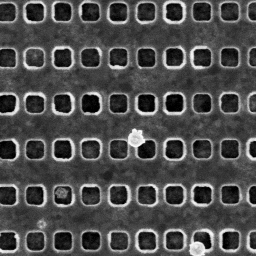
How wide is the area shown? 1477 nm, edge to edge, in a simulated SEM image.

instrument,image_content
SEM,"a regular array of holes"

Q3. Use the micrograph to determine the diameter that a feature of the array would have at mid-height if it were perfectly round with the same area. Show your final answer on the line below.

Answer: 117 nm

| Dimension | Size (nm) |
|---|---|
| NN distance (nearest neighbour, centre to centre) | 159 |